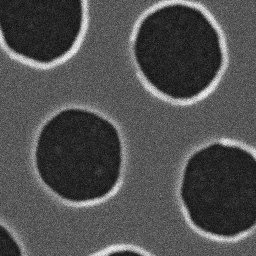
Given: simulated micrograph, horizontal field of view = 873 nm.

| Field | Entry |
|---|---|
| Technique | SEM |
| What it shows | holes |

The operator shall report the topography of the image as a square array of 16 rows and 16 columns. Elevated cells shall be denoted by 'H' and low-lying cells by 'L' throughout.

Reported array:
LLLLLHHHHHLLHHHH
LLLLLHHHHLLLLHHH
LLLLLHHHLLLLLLHH
HHLLHHHHLLLLLLHH
HHHHHHHHHLLLLLHH
HHHHHHHHHHLLLHHH
HHHHHHHHHHHHHHHH
HHHLLLLHHHHHHHHH
HHLLLLLHHHHHHHHH
HHLLLLLLHHHHLLLH
HHLLLLLLHHHHLLLL
HHHLLLLHHHHLLLLL
HHHHLLHHHHHLLLLL
HHHHHHHHHHHHLLLL
HHHHHHHHHHHHHLLH
LHHHHHHHHHHHHHHH